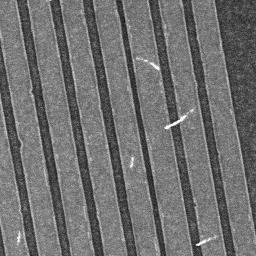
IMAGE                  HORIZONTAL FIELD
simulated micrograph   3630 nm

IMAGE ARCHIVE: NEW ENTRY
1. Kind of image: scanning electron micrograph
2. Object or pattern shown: parallel lines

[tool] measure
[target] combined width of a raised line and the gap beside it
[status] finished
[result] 459 nm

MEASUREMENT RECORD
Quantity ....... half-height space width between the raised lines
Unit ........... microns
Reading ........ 0.148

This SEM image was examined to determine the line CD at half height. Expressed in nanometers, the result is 313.